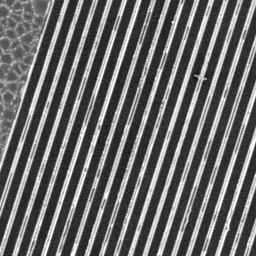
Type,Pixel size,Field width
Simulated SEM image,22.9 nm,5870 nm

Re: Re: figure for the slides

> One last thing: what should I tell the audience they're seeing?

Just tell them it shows parallel lines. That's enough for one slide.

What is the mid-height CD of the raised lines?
73.8 nm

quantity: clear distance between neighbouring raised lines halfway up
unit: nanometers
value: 251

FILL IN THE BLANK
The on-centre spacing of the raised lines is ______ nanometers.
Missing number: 316